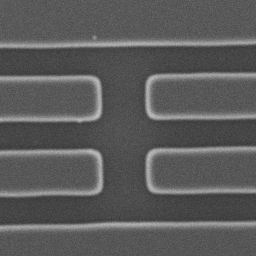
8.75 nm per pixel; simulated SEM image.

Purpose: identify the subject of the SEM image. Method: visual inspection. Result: groups of lines, slits or small figures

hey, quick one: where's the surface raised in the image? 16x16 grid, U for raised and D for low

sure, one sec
UUUUUUUUUUUUUUUU
UUUUUUUUUUUUUUUU
UUUUUUUUUUUUUUUU
DDDDDDDDDDDDDDDD
DDDDDDDDDDDDDDDD
UUUUUUDDDUUUUUUU
UUUUUUDDDUUUUUUU
UDDDUDDDDDDDDDDD
DDDDDDDDDDDDDDDD
DDUUUUDDDDUUUUUU
UUUUUUDDDUUUUUUU
UUUUUUDDDUUUUUUU
DDDDDDDDDDDDDDDD
DDDDDDDDDDDDDDDD
UUUUUUUUUUUUUUUU
UUUUUUUUUUUUUUUU